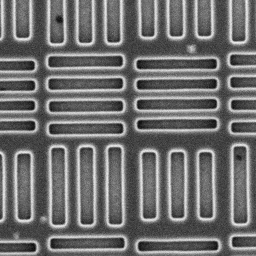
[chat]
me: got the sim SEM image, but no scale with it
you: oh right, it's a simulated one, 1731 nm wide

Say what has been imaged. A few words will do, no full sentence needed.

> groups of lines, slits or small figures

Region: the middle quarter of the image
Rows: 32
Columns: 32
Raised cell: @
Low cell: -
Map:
--------------@@@@--------------
@@@@@@@@@@@@@@@@@@@-----------@@
@@@@@@@@@@@@@@@@@@@@@@@@@@@@@@@@
--------------@@@@@@@@@@@@@@@@@@
---------------@@@--------------
---------------@@@--------------
----@@@@@@@@@@@@@@@------@@@@@@@
@@@@@@@@@@@@@@@@@@@@@@@@@@@@@@@@
@@@@@@@@@@@@@@@@@@@@@@@@@@@@@@@@
---------------@@@--------------
---------------@@@--------------
---------------@@@@-------------
@@@@@@@@@@@@@@@@@@@@@@@@@@@@@@@@
@@@@@@@@@@@@@@@@@@@@@@@@@@@@@@@@
@@@@@@@@@@@@@@@@@@--------------
---------------@@@--------------
---------------@@@@-------------
--------------@@@@@@@@@@@@@@@@@@
@@@@@@@@@@@@@@@@@@@@@@@@@@@@@@@@
@@@@@@@@@@@@@@@@@@@@@@@@@@@@@@@@
@@@@@@@@@@@@@@@@@@@@@@@@@@@@@@@@
@@@@----@@@---@@@@@@@@@@@@@@@@@@
@@@@----@@@----@@@@@---@@@@---@@
@@@@----@@@----@@@@----@@@@---@@
@@@@----@@@----@@@@----@@@@---@@
@@@@----@@@----@@@@----@@@@---@@
-@@@----@@@----@@@@----@@@@---@@
-@@@----@@@----@@@@----@@@@---@@
-@@@----@@@----@@@@----@@@@---@@
-@@@----@@@----@@@@----@@@@---@@
-@@@----@@@----@@@@----@@@@---@@
-@@@----@@@----@@@@----@@@@---@@